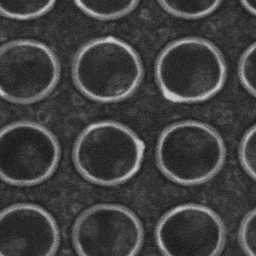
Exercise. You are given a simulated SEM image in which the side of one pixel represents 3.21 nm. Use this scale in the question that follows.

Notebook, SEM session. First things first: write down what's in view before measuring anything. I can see raised bodies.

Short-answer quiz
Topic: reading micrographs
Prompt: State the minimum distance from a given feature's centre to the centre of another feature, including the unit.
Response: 81.8 pixels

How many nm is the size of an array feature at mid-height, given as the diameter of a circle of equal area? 206